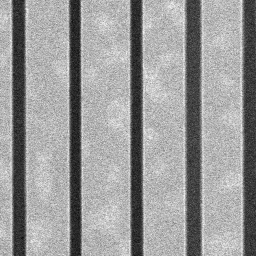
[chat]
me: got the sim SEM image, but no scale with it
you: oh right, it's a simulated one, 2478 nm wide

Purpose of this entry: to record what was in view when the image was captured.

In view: parallel lines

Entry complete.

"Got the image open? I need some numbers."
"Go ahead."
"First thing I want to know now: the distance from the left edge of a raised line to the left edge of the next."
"563 nanometers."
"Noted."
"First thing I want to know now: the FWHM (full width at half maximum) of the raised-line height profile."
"421 nm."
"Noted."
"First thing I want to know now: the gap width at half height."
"121 nanometers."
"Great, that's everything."